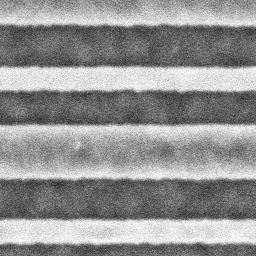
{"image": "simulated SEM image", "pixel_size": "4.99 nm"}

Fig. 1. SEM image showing lines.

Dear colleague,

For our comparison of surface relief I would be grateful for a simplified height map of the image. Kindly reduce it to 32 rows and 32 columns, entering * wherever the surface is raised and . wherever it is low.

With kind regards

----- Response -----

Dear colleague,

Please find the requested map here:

********************************
********************************
********************************
................................
................................
................................
................................
................................
*...*.......**..**.............*
********************************
********************************
................................
................................
................................
................................
................................
********************************
********************************
********************************
********************************
********************************
********************************
................................
................................
................................
................................
................................
................................
********************************
********************************
................................
................................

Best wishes